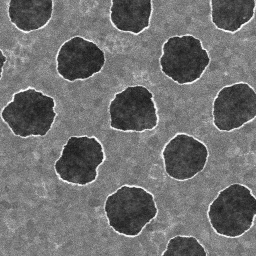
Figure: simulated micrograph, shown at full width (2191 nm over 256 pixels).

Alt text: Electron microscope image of holes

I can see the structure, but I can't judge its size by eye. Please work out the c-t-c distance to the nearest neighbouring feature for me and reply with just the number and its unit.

591 nanometers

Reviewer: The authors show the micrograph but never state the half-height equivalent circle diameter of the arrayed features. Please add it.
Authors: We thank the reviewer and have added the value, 408 nm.